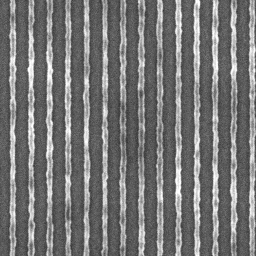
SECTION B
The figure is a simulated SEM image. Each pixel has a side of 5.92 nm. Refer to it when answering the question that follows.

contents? parallel lines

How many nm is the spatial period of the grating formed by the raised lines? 109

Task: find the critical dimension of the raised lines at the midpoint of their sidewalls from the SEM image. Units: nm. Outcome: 28.9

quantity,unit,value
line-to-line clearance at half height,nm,80.6